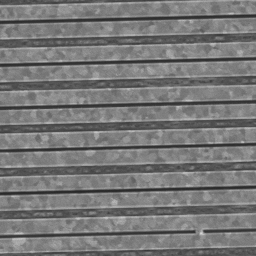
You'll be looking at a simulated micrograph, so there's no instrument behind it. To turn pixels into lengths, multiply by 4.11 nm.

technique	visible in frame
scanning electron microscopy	parallel lines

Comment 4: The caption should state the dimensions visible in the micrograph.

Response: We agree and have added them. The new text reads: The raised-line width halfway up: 60.1 nm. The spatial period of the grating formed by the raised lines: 87.2 nm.